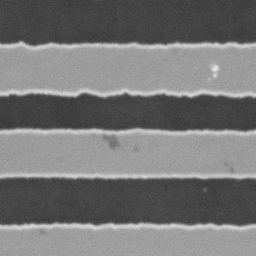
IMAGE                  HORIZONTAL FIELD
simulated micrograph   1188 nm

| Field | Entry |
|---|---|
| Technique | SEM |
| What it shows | lines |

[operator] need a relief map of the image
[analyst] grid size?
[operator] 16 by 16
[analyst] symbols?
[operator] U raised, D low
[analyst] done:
DDDDDDDDDDDDDDDD
DDDDDDDDDDDDDDDD
DDDDDDDDDDDDDDDD
UUUUUUUUUUUUUUUU
UUUUUUUUUUUUUUUU
UUUUUUUUUUUUUUUU
DDDDDDDDDDDDDDDD
DDDDDDDDDDDDDDDD
UUUUUUUUUUUUUUUU
UUUUUUUUUUUUUUUU
UUUUUUUUUUUUUUUU
DDDDDDDDDDDDDDDD
DDDDDDDDDDDDDDDD
DDDDDDDDDDDDDDDD
UUUUUUUUUUUUUUUU
UUUUUUUUUUUUUUUU